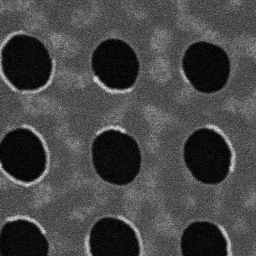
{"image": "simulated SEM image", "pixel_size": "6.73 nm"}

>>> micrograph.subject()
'holes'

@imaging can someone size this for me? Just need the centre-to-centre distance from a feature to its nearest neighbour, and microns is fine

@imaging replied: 0.601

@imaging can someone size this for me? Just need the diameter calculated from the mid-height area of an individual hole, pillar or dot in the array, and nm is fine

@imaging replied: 349